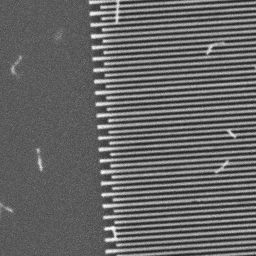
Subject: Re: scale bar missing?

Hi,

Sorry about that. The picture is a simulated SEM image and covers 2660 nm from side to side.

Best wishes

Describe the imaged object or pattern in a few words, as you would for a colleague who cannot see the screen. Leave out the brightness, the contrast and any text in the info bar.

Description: parallel lines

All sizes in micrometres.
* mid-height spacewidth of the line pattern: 0.035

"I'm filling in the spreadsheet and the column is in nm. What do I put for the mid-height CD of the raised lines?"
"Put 27.2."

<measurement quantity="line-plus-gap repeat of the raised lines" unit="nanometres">59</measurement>